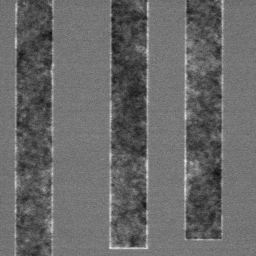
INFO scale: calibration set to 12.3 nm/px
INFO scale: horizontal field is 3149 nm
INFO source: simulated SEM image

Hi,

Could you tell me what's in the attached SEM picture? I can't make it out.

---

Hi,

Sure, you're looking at one or a few lines or trenches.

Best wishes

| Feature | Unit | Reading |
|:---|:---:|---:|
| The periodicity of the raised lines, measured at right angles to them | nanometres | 1050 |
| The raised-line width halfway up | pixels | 37.2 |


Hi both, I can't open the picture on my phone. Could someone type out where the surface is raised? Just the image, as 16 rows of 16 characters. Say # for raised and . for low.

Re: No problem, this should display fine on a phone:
.##....##...##..
.##....##...##..
.##....##...##..
.##....##...##..
.##....##...##..
.##....##...##..
.##....##...##..
.##....##...##..
.##....##...##..
.##....##...##..
.##....##...##..
.##....##...##..
.##....##...##..
.##....##...##..
.##....##...##..
.##....##.......